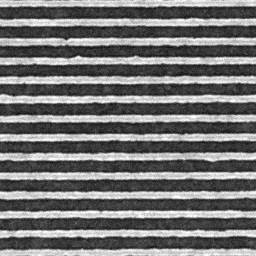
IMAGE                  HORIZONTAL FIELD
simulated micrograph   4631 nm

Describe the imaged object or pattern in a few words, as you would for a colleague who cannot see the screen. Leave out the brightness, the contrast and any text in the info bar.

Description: parallel lines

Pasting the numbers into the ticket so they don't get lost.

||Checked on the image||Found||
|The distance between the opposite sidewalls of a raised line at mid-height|99.5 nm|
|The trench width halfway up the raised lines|0.251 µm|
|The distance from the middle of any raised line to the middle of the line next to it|347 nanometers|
